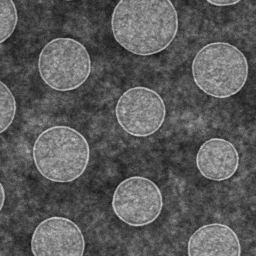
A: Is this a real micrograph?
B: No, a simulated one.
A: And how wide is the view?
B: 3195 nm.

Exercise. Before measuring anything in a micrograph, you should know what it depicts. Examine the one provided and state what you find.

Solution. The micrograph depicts raised bodies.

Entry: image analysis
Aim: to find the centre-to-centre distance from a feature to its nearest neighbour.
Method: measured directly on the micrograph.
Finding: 1120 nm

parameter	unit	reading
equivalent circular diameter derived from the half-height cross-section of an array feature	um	0.622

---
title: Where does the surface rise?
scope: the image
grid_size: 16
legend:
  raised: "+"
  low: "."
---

+......++++.....
+......++++.....
.......++++.....
...++.......+++.
...+++......+++.
...++........++.
+......+++......
+......+++......
...++...........
..++++......+++.
..+++.......+++.
........++......
.......+++......
.......+++......
..+++.......+++.
..+++.......+++.